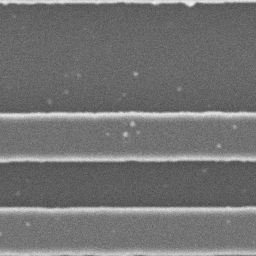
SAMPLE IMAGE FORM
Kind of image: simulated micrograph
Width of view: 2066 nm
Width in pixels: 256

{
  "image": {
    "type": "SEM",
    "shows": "lines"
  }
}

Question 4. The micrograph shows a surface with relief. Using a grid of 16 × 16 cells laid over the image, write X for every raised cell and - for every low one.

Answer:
----------------
----------------
----------------
----------------
----------------
----------------
----------------
XXXXXXXXXXXXXXXX
XXXXXXXXXXXXXXXX
XXXXXXXXXXXXXXXX
----------------
----------------
----------------
XXXXXXXXXXXXXXXX
XXXXXXXXXXXXXXXX
XXXXXXXXXXXXXXXX